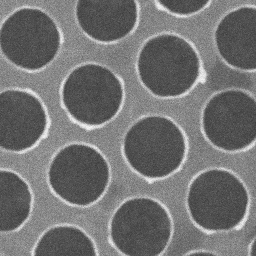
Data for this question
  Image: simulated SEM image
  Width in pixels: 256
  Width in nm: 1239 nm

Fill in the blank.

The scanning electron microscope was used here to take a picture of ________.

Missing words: holes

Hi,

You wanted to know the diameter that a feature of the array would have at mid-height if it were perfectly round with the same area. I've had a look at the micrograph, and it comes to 291 nm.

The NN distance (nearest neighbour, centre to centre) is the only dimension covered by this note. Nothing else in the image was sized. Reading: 391 nanometres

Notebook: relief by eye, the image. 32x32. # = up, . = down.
##########.......###......######
##...#####.......#####..#####...
#......###.......###########....
.......###.......##########.....
.......####.....####..#####.....
.......###########......###.....
.......###########......###.....
#.....###########........###....
###..#####...####........#####..
#########.....####.......#######
########.......###......########
#..#####.......####....#####..##
.....###.......###########......
.....###.......###########......
......###.....###########.......
......#####..####.....###.......
.....###########.......###......
.....###########.......###......
#..#####....####.......#####..##
#######......###.......#########
######.......###......##########
.#####........###....#####..####
...###........##########......##
....###......###########.......#
....###......###########.......#
....#####..####.....####.......#
....###########......###.......#
...###########.......###......##
..#####..#####.......#####...###
#####......###.......###########
#####.......##.......###########
####........###.....###########.